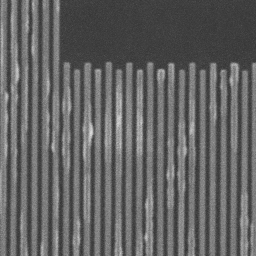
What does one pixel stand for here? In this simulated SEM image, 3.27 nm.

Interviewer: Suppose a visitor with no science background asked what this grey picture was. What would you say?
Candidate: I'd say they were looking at parallel lines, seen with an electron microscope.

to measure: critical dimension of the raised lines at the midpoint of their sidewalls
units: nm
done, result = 19.2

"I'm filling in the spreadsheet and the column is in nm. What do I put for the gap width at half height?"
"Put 16.3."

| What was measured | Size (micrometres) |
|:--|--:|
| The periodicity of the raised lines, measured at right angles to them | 0.0343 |